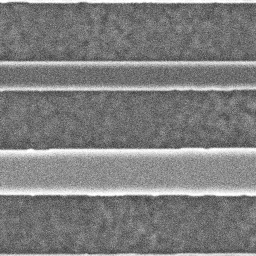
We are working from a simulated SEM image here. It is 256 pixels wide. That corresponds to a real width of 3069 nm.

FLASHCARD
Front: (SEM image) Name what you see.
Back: lines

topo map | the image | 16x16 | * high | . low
................
................
................
................
................
................
................
................
................
****************
****************
****************
................
................
................
................